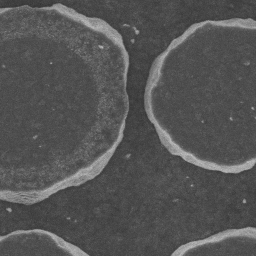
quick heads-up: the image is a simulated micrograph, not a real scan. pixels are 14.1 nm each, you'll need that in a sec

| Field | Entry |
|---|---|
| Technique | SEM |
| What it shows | raised bodies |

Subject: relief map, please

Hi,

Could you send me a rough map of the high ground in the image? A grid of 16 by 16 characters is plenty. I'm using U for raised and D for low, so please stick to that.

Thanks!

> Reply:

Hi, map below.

DUDUDDDDDDDDDDDD
UUUUUUDDDDDDDUUD
UUUUUUUDDDDUUUUU
UUUUUUUUDDUUUUUU
UUUUUUUUDDUUUUUU
UUUUUUUUDUUUUUUU
UUUUUUUUDUUUUUUU
UUUUUUUUDDUUUUUU
UUUUUUUUDDUUUUUU
UUUUUUUDDDDUUUUU
UUUUUUDDDDDDDDUD
UUUUDDDDDDDDDDDD
DDDDDDDDDDDDDDDD
DDDDDDDDDDDDDDDD
DUUDDDDDDDDDDDDU
UUUUDDDDDDDDUUUU